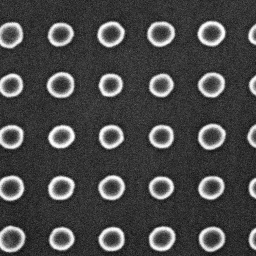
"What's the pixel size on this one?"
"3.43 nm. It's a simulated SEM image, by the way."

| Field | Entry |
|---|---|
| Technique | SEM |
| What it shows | a regular array of raised bodies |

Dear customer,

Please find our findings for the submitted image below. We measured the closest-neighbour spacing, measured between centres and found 172 nm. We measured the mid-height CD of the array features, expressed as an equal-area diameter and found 79.4 nm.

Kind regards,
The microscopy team